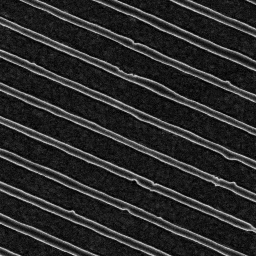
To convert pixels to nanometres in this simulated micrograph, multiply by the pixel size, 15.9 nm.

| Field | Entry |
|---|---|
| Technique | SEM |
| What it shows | parallel lines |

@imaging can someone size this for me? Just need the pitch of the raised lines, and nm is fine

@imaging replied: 481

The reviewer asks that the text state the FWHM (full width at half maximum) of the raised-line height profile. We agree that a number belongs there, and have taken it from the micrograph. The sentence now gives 117 nm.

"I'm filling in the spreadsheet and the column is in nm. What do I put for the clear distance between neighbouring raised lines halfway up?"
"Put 367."